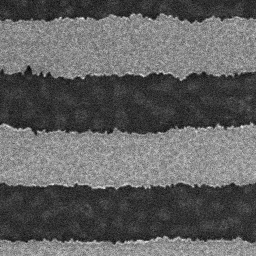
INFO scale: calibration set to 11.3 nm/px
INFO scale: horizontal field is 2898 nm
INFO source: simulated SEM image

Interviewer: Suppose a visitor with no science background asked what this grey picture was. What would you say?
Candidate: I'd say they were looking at one or a few lines or trenches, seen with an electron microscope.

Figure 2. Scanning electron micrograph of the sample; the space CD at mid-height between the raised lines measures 637 nm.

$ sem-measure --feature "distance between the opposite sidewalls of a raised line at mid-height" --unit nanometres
621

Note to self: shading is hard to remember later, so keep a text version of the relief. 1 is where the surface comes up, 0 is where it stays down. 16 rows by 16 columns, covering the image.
0000000000000000
1111111111111111
1111111111111111
1111111111111111
1011111111110110
0000000000000000
0000000000000000
0000000000000000
1111111111111111
1111111111111111
1111111111111111
1110111111101111
0000000000000000
0000000000000000
0000000000000000
1111111111111111